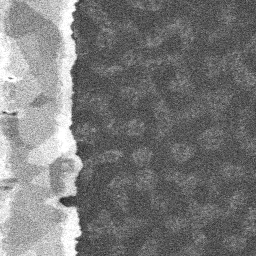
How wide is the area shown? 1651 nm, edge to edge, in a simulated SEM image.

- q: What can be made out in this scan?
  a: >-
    one or a few lines or trenches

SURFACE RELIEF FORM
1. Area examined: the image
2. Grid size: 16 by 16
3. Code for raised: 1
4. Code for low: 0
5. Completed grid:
1111000000000000
1111000000000000
1111000000000000
1111000000000000
1111000000000000
1111000000000000
1111000000000000
1111000000000000
1111000000000000
1111000000000000
1111100000000000
1111000000000000
1111000000000000
1111000000000000
1111000000000000
1111000000000000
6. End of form